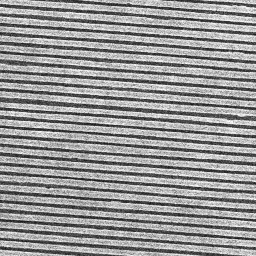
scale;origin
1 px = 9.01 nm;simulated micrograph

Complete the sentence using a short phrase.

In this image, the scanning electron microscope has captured parallel lines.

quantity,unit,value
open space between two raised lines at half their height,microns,0.0348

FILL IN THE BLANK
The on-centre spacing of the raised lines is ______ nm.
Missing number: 83.8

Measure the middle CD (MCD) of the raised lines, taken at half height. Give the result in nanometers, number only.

52.8